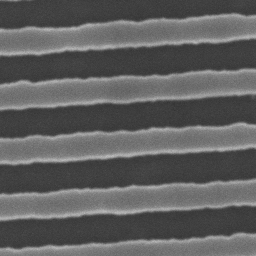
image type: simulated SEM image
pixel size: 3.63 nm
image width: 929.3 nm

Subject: lines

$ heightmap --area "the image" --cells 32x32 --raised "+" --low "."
................................
................................
..................++++++++++++++
...++....+++++++++++++++++++++++
++++++++++++++++++++++++++++++++
++++++++++++++++++++............
+++++++.........................
................................
................................
...................+.+++++++++++
.+++++++++++++++++++++++++++++++
++++++++++++++++++++++++++++++++
++++++++++++++++++++............
+++.............................
................................
.............................++.
............+.++++++++++++++++++
++++++++++++++++++++++++++++++++
+++++++++++++++++++++++++++++++.
++++++++++++++++................
................................
................................
...............................+
...............+++++++++++++++++
++++++++++++++++++++++++++++++++
++++++++++++++++++++++++++++++++
++++++++++++++++++..............
................................
................................
.............................+++
..............++++++++++++++++++
++++++++++++++++++++++++++++++++